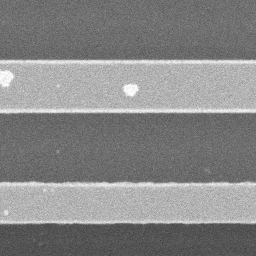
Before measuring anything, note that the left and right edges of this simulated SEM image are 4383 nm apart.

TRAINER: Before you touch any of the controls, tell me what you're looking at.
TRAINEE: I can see lines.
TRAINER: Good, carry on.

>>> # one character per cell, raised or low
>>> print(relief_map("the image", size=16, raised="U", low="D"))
DDDDDDDDDDDDDDDD
DDDDDDDDDDDDDDDD
DDDDDDDDDDDDDDDD
DDDDDDDDDDDDDDDD
UUUUUUUUUUUUUUUU
UUUUUUUUUUUUUUUU
UUUUUUUUUUUUUUUU
DDDDDDDDDDDDDDDD
DDDDDDDDDDDDDDDD
DDDDDDDDDDDDDDDD
DDDDDDDDDDDDDDDD
UUUUUDUUUUUUUUUU
UUUUUUUUUUUUUUUU
UUUUUUUUUUUUUUUU
DDDDDDDDDDDDDDDD
DDDDDDDDDDDDDDDD